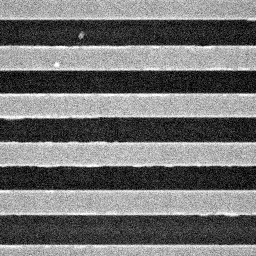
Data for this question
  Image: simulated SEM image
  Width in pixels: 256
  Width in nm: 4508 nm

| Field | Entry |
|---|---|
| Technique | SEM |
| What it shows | lines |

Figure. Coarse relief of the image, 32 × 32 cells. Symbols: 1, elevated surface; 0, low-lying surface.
11111111111111111111111111111111
11111111111111111111111111111111
00000000000000000000000000000000
00000000000000000000000000000000
00000000000000000000000000000000
00000000000000000000000000000000
11111111111111111111111111111111
11111111111111111111111111111111
11111111111111111111111111111111
00000000000000000000000000000000
00000000000000000000000000000000
00000000000000000000000000000000
11111111111111111111111111111111
11111111111111111111111111111111
11111111111111111111111111111111
00000000000000000000000000000000
00000000000000000000000000000000
00000000000000000000000000000000
11111111111111111111111111111111
11111111111111111111111111111111
11111111111111111111111111111111
00000000000000000000000000000000
00000000000000000000000000000000
00000000000000000000000000000000
11111111111111111111111111111111
11111111111111111111111111111111
11111111111111111111111111111111
00000000000000000000000000000000
00000000000000000000000000000000
00000000000000000000000000000000
00000000000000000000000000000000
11111111111111111111111111111111